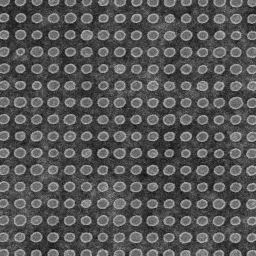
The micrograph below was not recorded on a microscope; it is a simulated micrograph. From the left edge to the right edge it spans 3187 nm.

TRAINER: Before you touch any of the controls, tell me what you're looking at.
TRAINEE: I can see a regular array of raised bodies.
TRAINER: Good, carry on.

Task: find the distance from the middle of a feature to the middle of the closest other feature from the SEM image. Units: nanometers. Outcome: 204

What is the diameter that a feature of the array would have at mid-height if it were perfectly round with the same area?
9.64 pixels